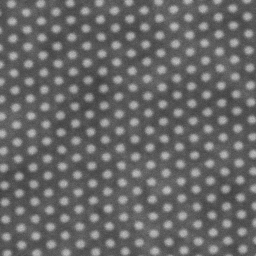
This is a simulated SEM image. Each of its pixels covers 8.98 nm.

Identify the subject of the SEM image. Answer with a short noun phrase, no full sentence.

a regular array of raised bodies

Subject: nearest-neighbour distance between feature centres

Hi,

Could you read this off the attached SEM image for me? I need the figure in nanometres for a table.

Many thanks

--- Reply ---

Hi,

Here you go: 151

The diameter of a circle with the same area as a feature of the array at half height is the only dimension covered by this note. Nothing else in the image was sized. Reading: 0.0664 micrometres